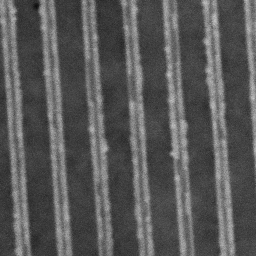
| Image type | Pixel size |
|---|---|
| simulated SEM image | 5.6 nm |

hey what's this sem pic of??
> parallel lines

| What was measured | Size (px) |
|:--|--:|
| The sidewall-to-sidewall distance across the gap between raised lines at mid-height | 28.6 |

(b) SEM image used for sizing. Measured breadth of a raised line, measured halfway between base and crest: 71.9 nanometers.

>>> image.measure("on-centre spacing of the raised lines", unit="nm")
227